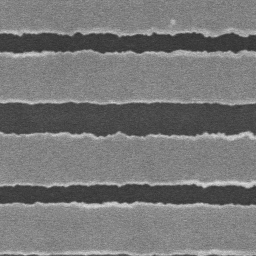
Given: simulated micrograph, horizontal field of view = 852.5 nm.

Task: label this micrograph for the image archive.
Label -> lines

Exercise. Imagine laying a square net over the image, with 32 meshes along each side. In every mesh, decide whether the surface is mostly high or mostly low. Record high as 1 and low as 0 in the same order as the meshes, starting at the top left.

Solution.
11111111111111111111111111111111
11111111111111111111111111111111
11111111111111111111111111111111
11111111111111111111111111111111
00000000000000000000000000100010
00000000000000000000000000000000
00000100101100001000001100001011
11111111111111111111111111111111
11111111111111111111111111111111
11111111111111111111111111111111
11111111111111111111111111111111
11111111111111111111111111111111
11111111111111111111111111111111
00000000000000000000000000000000
00000000000000000000000000000000
00000000000000000000000000000000
00000000000000000000000000000010
11111111111111111111111111111111
11111111111111111111111111111111
11111111111111111111111111111111
11111111111111111111111111111111
11111111111111111111111111111111
11111111111111111111111111111111
00000000000000000000000000000000
00000000000000000000000000000000
01101011111001111110000010000000
11111111111111111111111111111111
11111111111111111111111111111111
11111111111111111111111111111111
11111111111111111111111111111111
11111111111111111111111111111111
11111111111111111111111111111111